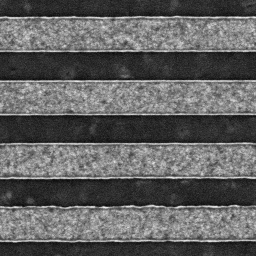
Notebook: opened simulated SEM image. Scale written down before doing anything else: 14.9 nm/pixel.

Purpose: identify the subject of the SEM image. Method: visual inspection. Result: one or a few lines or trenches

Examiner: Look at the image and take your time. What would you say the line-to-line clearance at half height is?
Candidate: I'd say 0.431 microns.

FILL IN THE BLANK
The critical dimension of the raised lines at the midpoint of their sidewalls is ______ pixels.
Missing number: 34.3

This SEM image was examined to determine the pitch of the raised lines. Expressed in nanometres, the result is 940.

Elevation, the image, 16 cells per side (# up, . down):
................
################
################
................
................
################
################
................
................
################
################
................
................
################
################
................